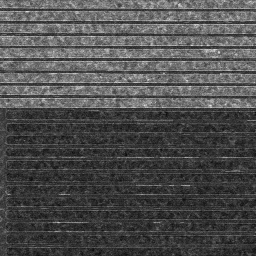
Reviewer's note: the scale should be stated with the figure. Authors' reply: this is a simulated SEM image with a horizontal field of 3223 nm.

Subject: parallel lines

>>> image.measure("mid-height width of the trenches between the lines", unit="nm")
45.6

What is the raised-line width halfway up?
113 nm